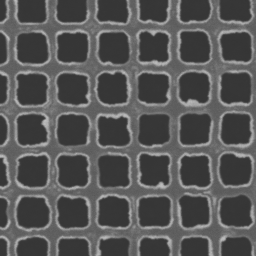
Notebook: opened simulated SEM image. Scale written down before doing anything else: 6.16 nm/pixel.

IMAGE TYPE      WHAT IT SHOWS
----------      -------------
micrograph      a regular array of holes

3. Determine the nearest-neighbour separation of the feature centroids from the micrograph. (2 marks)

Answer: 248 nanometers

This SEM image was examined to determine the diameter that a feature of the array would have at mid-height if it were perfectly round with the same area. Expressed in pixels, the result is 33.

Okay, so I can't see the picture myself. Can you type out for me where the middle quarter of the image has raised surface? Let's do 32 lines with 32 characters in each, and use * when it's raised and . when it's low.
********************************
********************************
...******......****......*****..
......**........***.......***...
......**........***.......***...
......**........**........***...
......**........***.......***...
......**........***.......***...
......***.......***.......***...
......***.......****......******
********************************
********************************
***********************..*****..
......***...**..***.......***...
......***.......***.......***...
......***.......***.......***...
......***.......***.......***...
......***.......***.......***...
......***........**.......***...
......***.......***.......***...
...**********.******************
********************************
********************.***********
.....****.......***.......****..
......***.......***........**...
......***.......***.......***...
......***.......***.......***...
......***.......***.......***...
......***.......***.......***...
......***.......***.......****..
.....****.......****************
********************************